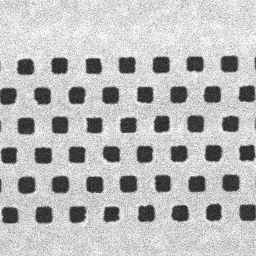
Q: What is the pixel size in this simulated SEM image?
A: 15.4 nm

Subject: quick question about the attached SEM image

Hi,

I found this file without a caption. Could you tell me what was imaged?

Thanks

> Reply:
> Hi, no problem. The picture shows a regular array of holes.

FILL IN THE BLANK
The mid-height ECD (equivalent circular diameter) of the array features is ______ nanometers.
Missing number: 277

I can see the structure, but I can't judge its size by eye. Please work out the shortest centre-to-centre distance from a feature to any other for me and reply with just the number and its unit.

520 nm